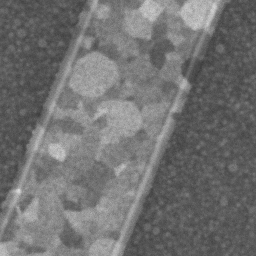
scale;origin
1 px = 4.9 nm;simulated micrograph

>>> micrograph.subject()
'one or a few lines or trenches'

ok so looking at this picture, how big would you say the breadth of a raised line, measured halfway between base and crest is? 114 pixels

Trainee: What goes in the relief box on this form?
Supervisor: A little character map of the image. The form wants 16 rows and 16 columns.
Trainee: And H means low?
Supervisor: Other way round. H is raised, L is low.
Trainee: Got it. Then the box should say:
LLLLLLHHHHHHHLLL
LLLLLHHHHHHHHLLL
LLLLLHHHHHHHHLLL
LLLLLHHHHHHHLLLL
LLLLHHHHHHHHLLLL
LLLLHHHHHHHLLLLL
LLLHHHHHHHHLLLLL
LLLHHHHHHHHLLLLL
LLLHHHHHHHLLLLLL
LLHHHHHHHHLLLLLL
LLHHHHHHHLLLLLLL
LHHHHHHHHLLLLLLL
LHHHHHHHHLLLLLLL
HHHHHHHHLLLLLLLL
HHHHHHHHLLLLLLLL
HHHHHHHLLLLLLLLL